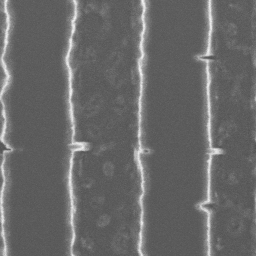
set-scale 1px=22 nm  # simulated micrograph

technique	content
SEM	one or a few lines or trenches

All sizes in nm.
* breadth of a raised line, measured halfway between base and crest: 1490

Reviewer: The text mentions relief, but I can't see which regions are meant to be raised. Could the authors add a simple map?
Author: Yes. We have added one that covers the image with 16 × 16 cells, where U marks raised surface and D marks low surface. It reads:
UUUUUDDDDUUUUDDD
UUUUUDDDDUUUUDDD
UUUUDDDDDUUUUDDD
UUUUDDDDDUUUUDDD
UUUUDDDDDUUUUDDD
UUUUDDDDDUUUUDDD
UUUUDDDDDUUUUDDD
UUUUUDDDDUUUUDDD
UUUUUDDDDUUUUDDD
UUUUUDDDDUUUUDDD
UUUUDDDDDUUUUDDD
UUUUDDDDDUUUUDDD
UUUUUDDDDUUUUDDD
UUUUUDDDDUUUUDDD
UUUUUDDDDUUUUDDD
UUUUUDDDDUUUUDDD